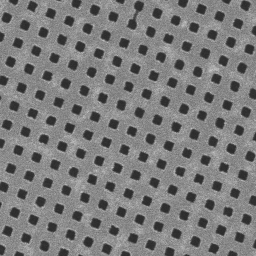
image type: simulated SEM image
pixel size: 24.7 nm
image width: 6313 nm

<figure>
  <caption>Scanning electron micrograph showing a regular array of holes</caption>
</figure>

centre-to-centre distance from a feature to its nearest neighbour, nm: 483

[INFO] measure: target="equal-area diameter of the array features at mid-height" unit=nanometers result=258